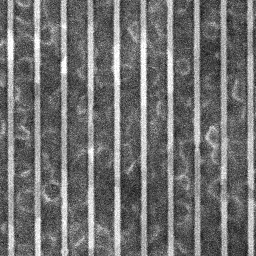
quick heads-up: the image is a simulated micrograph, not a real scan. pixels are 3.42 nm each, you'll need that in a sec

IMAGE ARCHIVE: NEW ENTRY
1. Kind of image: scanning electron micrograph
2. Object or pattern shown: parallel lines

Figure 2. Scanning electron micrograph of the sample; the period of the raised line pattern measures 91.1 nanometres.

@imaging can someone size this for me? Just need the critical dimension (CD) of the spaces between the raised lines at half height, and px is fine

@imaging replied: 22.7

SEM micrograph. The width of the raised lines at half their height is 12.8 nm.